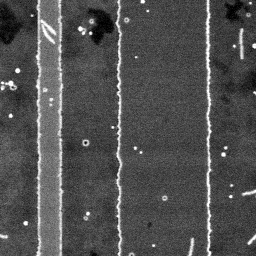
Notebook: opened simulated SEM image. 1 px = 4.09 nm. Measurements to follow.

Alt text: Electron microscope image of lines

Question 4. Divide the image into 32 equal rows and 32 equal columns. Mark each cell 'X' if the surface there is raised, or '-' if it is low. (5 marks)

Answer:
-----XX--------XXXXXXXXXXX------
-----XX--------XXXXXXXXXXX------
-----XX--------XXXXXXXXXXX------
-----XXX-------XXXXXXXXXXX------
-----XX--------XXXXXXXXXXX------
-----XX--------XXXXXXXXXXX------
-----XX--------XXXXXXXXXXX------
-----XX--------XXXXXXXXXXX------
-----XX--------XXXXXXXXXXX------
-----XXX-------XXXXXXXXXXX------
-----XXX-------XXXXXXXXXXX------
-----XXX-------XXXXXXXXXXX------
-----XXX-------XXXXXXXXXXX------
-----XX--------XXXXXXXXXXX------
-----XX--------XXXXXXXXXXX------
-----XXX-------XXXXXXXXXXX------
-----XX--------XXXXXXXXXXX------
-----XX--------XXXXXXXXXXX------
-----XXX-------XXXXXXXXXXX------
-----XXX-------XXXXXXXXXXX------
-----XXX-------XXXXXXXXXXX------
-----XX--------XXXXXXXXXXX------
-----XX--------XXXXXXXXXXX------
-----XXX-------XXXXXXXXXXX------
-----XXX-------XXXXXXXXXXX------
-----XXX-------XXXXXXXXXXX------
-----XXX-------XXXXXXXXXXX------
-----XXX-------XXXXXXXXXXX------
-----XXX-------XXXXXXXXXXX------
-----XXX-------XXXXXXXXXXX------
-----XXX-------XXXXXXXXXXX------
-----XXX-------XXXXXXXXXXX------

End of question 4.